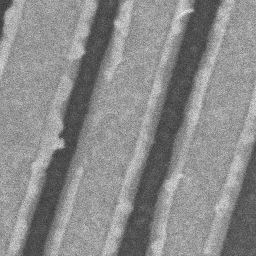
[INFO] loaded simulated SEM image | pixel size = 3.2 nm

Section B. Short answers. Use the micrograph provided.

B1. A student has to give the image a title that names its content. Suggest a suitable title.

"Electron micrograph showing one or a few lines or trenches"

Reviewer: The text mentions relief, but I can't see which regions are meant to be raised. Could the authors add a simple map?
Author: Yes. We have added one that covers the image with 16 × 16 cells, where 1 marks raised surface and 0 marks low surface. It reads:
0111110011110011
1111110111100011
1111100111100111
1111100111100111
1111000111000111
1111001111001111
1111001111001111
1111001110001111
1111011110011111
1110011110011110
1110011110011110
1100111100111110
1100111100111100
1100111100111100
1101111100111100
1001111000111000